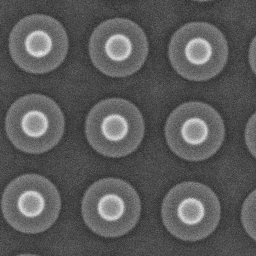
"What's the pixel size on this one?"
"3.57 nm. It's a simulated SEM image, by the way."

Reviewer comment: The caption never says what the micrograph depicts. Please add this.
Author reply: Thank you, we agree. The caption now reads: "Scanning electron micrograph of an array of small figures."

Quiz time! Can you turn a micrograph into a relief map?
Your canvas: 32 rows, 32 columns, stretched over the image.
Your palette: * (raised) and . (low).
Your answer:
................................
................................
...****.......**................
..******....******.....****.....
.*******...*******....******....
.*******...*******...*******...*
.*******...*******...*******...*
..******...*******...*******...*
...****.....*****.....******...*
..............**.......****.....
................................
................................
..****.......***................
.******.....*****.....*****.....
.*******...*******...******.....
.*******...*******...*******...*
.*******...*******...*******...*
.******....*******...*******...*
..****......*****....******....*
.............**.......****......
................................
................................
..****.......**.................
.******....******.....****......
*******...*******....******....*
********..********..*******...**
*******...********..********..**
.******....******...*******...**
..****.....******....******....*
.............**.......****.....*
................................
................................